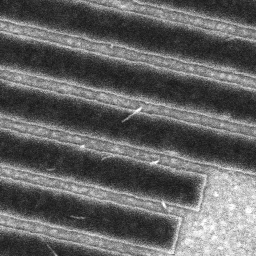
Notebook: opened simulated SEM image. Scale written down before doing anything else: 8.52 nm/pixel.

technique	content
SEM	parallel lines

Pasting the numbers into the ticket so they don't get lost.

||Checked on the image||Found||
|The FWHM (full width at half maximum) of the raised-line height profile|312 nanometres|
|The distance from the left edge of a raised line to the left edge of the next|404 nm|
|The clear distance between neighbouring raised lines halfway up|91.3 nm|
